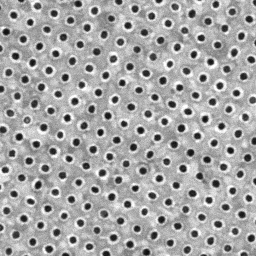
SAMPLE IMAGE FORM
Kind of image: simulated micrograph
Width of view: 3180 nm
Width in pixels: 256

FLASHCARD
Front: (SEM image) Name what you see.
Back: a regular array of holes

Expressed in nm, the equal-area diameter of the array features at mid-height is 103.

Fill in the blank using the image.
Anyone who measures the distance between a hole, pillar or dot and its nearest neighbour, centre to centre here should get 220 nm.